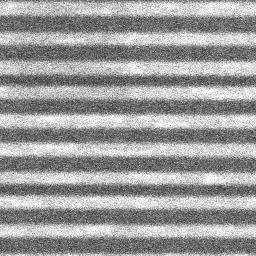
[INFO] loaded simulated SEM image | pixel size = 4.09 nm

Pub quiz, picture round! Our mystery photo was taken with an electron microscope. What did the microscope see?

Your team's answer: parallel lines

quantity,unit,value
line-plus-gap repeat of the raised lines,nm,114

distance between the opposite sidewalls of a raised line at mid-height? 45 nm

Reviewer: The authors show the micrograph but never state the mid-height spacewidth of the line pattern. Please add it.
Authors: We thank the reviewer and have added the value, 17 px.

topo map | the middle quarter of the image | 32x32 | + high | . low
++++++++++++++++++++++++++++++++
++++++++++++++++++++++++++++++++
++++++++++++++++++++++++++++++++
................................
................................
................................
++++++++++++++++++++++++++++++++
++++++++++++++++++++++++++++++++
++++++++++++++++++++++++++++++++
................................
................................
................................
................................
++++++++++++++++++++++++++++++++
++++++++++++++++++++++++++++++++
++++++++++++++++++++++++++++++++
................................
................................
................................
................................
++++++++++++++++++++++++++++++++
++++++++++++++++++++++++++++++++
++++++++++++++++++++++++++++++++
................................
................................
................................
................................
+++..........................+++
++++++++++++++++++++++++++++++++
++++++++++++++++++++++++++++++++
................................
................................